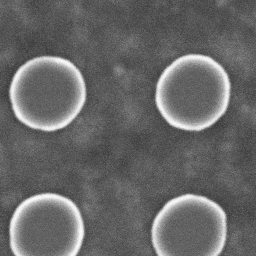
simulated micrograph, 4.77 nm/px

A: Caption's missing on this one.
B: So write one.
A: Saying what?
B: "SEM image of raised bodies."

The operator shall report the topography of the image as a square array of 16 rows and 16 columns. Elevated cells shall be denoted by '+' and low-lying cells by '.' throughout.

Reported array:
................
................
................
................
.++++.....++++..
.++++.....++++..
.++++.....++++..
.+++.......++...
................
................
................
................
..++.......++...
.++++.....++++..
.++++.....++++..
.++++.....++++..